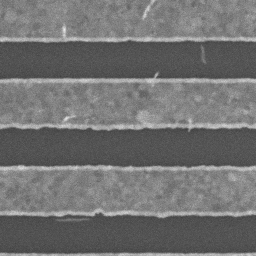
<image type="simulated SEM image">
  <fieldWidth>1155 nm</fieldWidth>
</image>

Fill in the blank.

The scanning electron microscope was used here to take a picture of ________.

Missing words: one or a few lines or trenches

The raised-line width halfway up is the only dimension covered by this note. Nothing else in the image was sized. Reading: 210 nm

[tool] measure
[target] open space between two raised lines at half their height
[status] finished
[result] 183 nanometers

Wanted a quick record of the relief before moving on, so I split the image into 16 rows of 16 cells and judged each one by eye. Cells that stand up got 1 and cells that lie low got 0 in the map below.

1111111111111111
1111111111111111
0111000100000000
0000000000000000
0000000000000000
1111111111111111
1111111111111111
1111111111111111
0000000000000000
0000000000000000
1111111100001110
1111111111111111
1111111111111111
0000000000000000
0000000000000000
0000000000000000